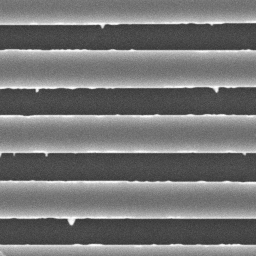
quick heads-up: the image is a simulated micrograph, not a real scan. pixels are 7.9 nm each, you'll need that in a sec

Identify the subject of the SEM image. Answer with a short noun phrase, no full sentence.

lines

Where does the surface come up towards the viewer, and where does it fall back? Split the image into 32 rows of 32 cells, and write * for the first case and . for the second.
********************************
********************************
********************************
................................
................................
................................
********************************
********************************
********************************
********************************
********************************
................................
................................
................................
********************************
********************************
********************************
********************************
********************************
................................
................................
................................
................................
********************************
********************************
********************************
********************************
................................
................................
................................
................................
********************************